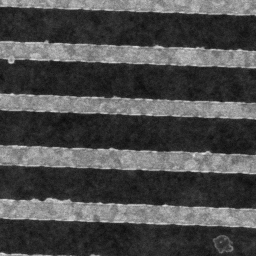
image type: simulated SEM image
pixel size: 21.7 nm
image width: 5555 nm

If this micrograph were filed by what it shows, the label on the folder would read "lines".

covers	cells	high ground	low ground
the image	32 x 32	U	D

UUUUUUUUUUUUUUUUUUUUUUUUUUUUUUUU
DDDDDDDDDDDDDDDDDDDDDDUUUUUUUUUU
DDDDDDDDDDDDDDDDDDDDDDDDDDDDDDDD
DDDDDDDDDDDDDDDDDDDDDDDDDDDDDDDD
DDDDDDDDDDDDDDDDDDDDDDDDDDDDDDDD
UUUUUUDDDDDDDDDDDDDDDDDDDDDDDDDD
UUUUUUUUUUUUUUUUUUUUUUUUUUUUUUUU
DUDDDUUUUUUUUUUUUUUUUUUUUUUUUUUU
DDDDDDDDDDDDDDDDDDDDDDDDDDDDDDDD
DDDDDDDDDDDDDDDDDDDDDDDDDDDDDDDD
DDDDDDDDDDDDDDDDDDDDDDDDDDDDDDDD
DDDDDDDDDDDDDDDDDDDDDDDDDDDDDDDD
UUUUUUUUUUUUUUUUUUUDDDDDDDDDDDDD
UUUUUUUUUUUUUUUUUUUUUUUUUUUUUUUU
DDDDDDDDDDDDDDDDDDDDDDDDUUUUUUUU
DDDDDDDDDDDDDDDDDDDDDDDDDDDDDDDD
DDDDDDDDDDDDDDDDDDDDDDDDDDDDDDDD
DDDDDDDDDDDDDDDDDDDDDDDDDDDDDDDD
UUUUUUDDDDDDDDDDDDDDDDDDDDDDDDDD
UUUUUUUUUUUUUUUUUUUUUUUUUUUUUUUD
UUUUUUUUUUUUUUUUUUUUUUUUUUUUUUUU
DDDDDDDDDDDDDDDDDDDDDDDDDDUUUUUU
DDDDDDDDDDDDDDDDDDDDDDDDDDDDDDDD
DDDDDDDDDDDDDDDDDDDDDDDDDDDDDDDD
DDDDDDDDDDDDDDDDDDDDDDDDDDDDDDDD
UUUUUUUUUUUUUDDDDDDDDDDDDDDDDDDD
UUUUUUUUUUUUUUUUUUUUUUUUUUUUUUUU
DDDDDDDDDUUUUUUUUUUUUUUUUUUUUUUU
DDDDDDDDDDDDDDDDDDDDDDDDDDDDDDDD
DDDDDDDDDDDDDDDDDDDDDDDDDDDDDDDD
DDDDDDDDDDDDDDDDDDDDDDDDDDDUDDDD
DDDDDDDDDDDDDDDDDDDDDDDDDDDDDDDD